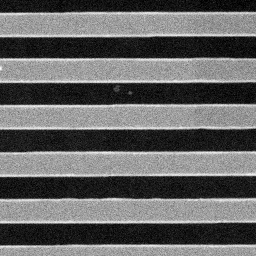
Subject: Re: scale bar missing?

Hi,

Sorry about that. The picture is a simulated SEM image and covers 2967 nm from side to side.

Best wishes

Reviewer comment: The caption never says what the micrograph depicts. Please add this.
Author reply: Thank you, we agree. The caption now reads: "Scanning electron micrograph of lines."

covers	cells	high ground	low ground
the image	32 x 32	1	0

00000000000000000000000000000000
00000000000000000000000000000000
11111111111111111111111111111111
11111111111111111111111111111111
11111111111111111110000000000000
00000000000000000000000000000000
00000000000000000000000000000000
11111111111111111111111111111111
11111111111111111111111111111111
11111111111111111111111111111111
00000000000000000000000000000000
00000000000000000000000000000000
00000000000000000000000000000000
11111111111111111111111111111111
11111111111111111111111111111111
11111111111111111111111111111111
00000000000000000000000000000000
00000000000000000000000000000000
00000000000000000000000000000000
11111111111111111111111111111111
11111111111111111111111111111111
11111111111111111111111111111111
00000000000000000000000000000000
00000000000000000000000000000000
00000000000000000000000000000000
11111111111111111111111111111111
11111111111111111111111111111111
11111111111111111111111111111111
00000000000000000000000000000000
00000000000000000000000000000000
00000000000000000000000000000000
11111111111111111111111111111111